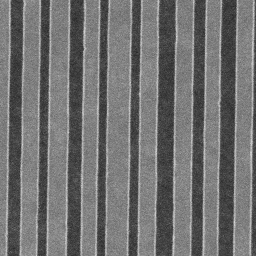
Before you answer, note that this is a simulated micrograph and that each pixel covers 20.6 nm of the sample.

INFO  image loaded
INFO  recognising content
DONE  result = parallel lines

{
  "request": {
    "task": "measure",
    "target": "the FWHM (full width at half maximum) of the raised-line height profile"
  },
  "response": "16.6 px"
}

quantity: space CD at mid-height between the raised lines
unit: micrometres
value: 0.271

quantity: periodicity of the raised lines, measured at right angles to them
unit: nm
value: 627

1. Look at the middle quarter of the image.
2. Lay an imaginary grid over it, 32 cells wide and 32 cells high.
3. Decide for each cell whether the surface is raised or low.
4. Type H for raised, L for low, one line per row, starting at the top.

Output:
HLLLLHHHHLLHHHHHLLLHHHHLLLLLHHHH
HLLLLHHHHLLHHHHHLLLHHHHLLLLLHHHH
HLLLLHHHHLLHHHHHLLLHHHHLLLLLHHHH
HLLLLHHHHLLHHHHHLLLHHHHLLLLLHHHH
HLLLLHHHLLLHHHHHLLLHHHHLLLLLHHHH
HLLLLHHHLLLHHHHHHLLHHHHLLLLLHHHH
HLLLLHHHLLLHHHHHHLLHHHHLLLLLHHHH
HLLLLHHHLLLHHHHHHLLHHHHLLLLLHHHH
HLLLLHHHLLLHHHHHLLLHHHHLLLLLHHHH
HLLLLHHHLLLHHHHHLLLHHHHLLLLLHHHH
HLLLLHHHLLLHHHHHLLLHHHHLLLLLHHHH
HLLLLHHHLLLHHHHHLLLHHHHLLLLLHHHH
HLLLLHHHLLLHHHHHLLLHHHHLLLLLHHHH
HLLLLHHHLLLHHHHHLLLHHHHLLLLLHHHH
HLLLLHHHLLLHHHHHLLLHHHHLLLLLHHHH
HLLLLHHHLLLHHHHHLLLHHHHLLLLLHHHH
HLLLLHHHLLLHHHHHLLLHHHHLLLLLHHHH
HLLLLHHHLLLHHHHHLLLHHHHLLLLLHHHH
HLLLLHHHLLLHHHHHLLLHHHHLLLLLHHHH
HLLLLHHHLLLHHHHHLLLHHHHLLLLLHHHH
HLLLLHHHLLLHHHHHLLLHHHHLLLLLHHHH
HLLLLHHHLLLHHHHHLLLHHHHLLLLLHHHH
HLLLLHHHLLLHHHHHLLLHHHHLLLLLHHHH
HLLLLHHHLLLHHHHHLLLHHHHLLLLLHHHH
HLLLLHHHLLLHHHHHLLLHHHHLLLLLHHHH
HLLLLHHHLLLHHHHHLLLHHHHLLLLLHHHH
HLLLHHHHLLLHHHHHLLLHHHHLLLLLHHHH
HLLLHHHHLLLHHHHHLLLHHHHLLLLLHHHH
HLLLHHHHLLLHHHHHLLLHHHHLLLLLHHHH
HLLLLHHHLLLHHHHHLLLHHHHLLLLLHHHH
HLLLLHHHLLLHHHHHLLLHHHHLLLLLHHHH
HLLLLHHHLLLHHHHHLLLHHHHLLLLLHHHH